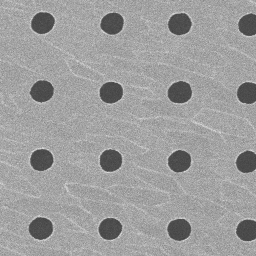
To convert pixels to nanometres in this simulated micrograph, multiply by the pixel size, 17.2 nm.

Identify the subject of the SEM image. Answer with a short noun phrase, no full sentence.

a regular array of holes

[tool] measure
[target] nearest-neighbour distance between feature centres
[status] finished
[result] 1180 nm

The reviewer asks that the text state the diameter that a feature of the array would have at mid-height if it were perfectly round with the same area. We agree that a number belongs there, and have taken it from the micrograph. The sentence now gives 0.397 µm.